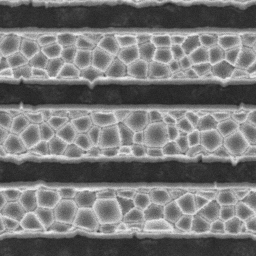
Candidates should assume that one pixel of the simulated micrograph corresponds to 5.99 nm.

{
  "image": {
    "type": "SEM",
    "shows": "one or a few lines or trenches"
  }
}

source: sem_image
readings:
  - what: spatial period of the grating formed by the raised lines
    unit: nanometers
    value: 462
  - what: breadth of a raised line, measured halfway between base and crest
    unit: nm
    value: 300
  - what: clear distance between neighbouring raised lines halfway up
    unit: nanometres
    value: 158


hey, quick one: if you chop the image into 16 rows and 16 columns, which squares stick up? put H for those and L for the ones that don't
LLLLLLLLLLLLLLLL
LLLLLLLLLLLLLLLL
HHHHHHHHHHHHHHHH
HHHHHHHHHHHHHHHH
HHHHHHHHHHHHHHHH
LLLLLLLLLLLLLLLL
LLLLLLLLLLLLLLLL
HHHHHHHHHHHHHHHH
HHHHHHHHHHHHHHHH
HHHHHHHHHHHHHHHH
LLLLLLLLLLLLLLLL
LLLLLLLLLLLLLLLL
HHHHHHHHHHHHHHHH
HHHHHHHHHHHHHHHH
HHHHHHHHHHHHHHHH
LLLLLLLLLLLLLLLL